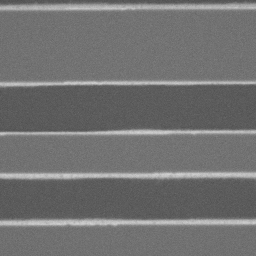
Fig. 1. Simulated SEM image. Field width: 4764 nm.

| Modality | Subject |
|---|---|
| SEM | lines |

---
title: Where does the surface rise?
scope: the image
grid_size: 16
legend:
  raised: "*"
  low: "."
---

...........*****
****************
****************
****************
****************
................
................
................
****************
****************
****************
................
................
................
****************
****************